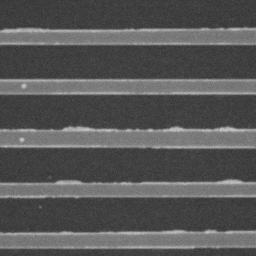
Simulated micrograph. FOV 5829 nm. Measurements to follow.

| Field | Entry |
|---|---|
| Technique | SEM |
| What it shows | lines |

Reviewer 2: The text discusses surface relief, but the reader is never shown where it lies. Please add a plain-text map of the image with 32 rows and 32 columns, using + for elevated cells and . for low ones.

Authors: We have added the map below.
................................
................................
................................
................................
++++++++++++++++++++++++++++++++
++++++++++++++++++++++++++++++++
................................
................................
................................
................................
++++++++++++++++++++++++++++++++
++++++++++++++++++++++++++++++++
................................
................................
................................
................................
++++++++++++++++++++++++++++++++
++++++++++++++++++++++++++++++++
................................
................................
................................
................................
................................
++++++++++++++++++++++++++++++++
++++++++++++++++++++++++++++++++
................................
................................
................................
................................
++++++++++++++++++++++++++++++++
++++++++++++++++++++++++++++++++
................................